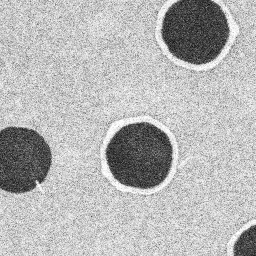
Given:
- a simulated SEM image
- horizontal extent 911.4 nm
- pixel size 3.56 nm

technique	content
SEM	holes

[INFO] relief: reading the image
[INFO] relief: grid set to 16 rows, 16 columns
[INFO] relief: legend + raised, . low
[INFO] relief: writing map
+++++++++++...++
++++++++++....++
++++++++++....++
+++++++++++...++
++++++++++++++++
++++++++++++++++
++++++++++++++++
++++++++++++++++
...++++...++++++
...++++....+++++
...++++....+++++
..++++++..++++++
++++++++++++++++
++++++++++++++++
+++++++++++++++.
+++++++++++++++.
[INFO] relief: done